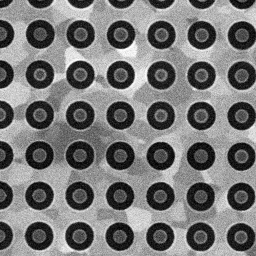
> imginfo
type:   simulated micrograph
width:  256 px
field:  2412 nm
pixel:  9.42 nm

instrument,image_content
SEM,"an array of small figures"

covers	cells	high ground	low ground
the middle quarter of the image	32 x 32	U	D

UDDDDDDUUUUDDDDDDUUUUDDDDDDUUUUU
DDDUUDDDUUUDDUUDDDUUUDDDDDDDUUUD
DDDUUUDDUUDDDUUUDDUUUDDUUUDDUUDD
DDDUUDDDUUDDDUUUDDUUUDDUUDDDUUUD
UDDDDDDUUUUDDDDDDDUUUDDDDDDDUUUD
UUDDDDDUUUUUDDDDDUUUUUDDDDDUUUUU
UUUDDUUUUUUUUDDUUUUUUUUDDUUUUUUU
UUUUUUUUUUUUUUUUUUUUUUUUUUUUUUUU
UUUUUUUUUUUUUUUUUUUUUUUUUUUUUUUU
UUDDDDUUUUUUUDDDUUUUUUUDDDUUUUUU
UDDDDDDUUUUDDDDDDUUUUDDDDDDUUUUU
DDDUUDDDUUUDDDUDDDUUUDDDDDDDUUUD
DDDUUDDDUUDDDUUUDDUUDDDUUUDDUUUD
DDDUUDDDUUDDDUUDDDUUDDDUUUDDUUUD
UDDDDDDUUUUDDDDDDDUUUDDDDDDDUUUD
UDDDDDDUUUUUDDDDDUUUUUDDDDDUUUUU
UUUDDUUUUUUUUDDUUUUUUUUDDUUUUUUU
UUUUUUUUUUUUUUUUUUUUUUUUUUUUUUUU
UUUUUUUUUUUUUUUUUUUUUUUUUUUUUUUU
UUDDDDUUUUUUUDDUUUUUUUUDDUUUUUUU
UDDDDDDUUUUDDDDDDUUUUUDDDDDUUUUU
UDDDDDDDUUUDDDDDDUUUUDDDUDDUUUUD
DDDUUDDDUUDDDUUUDDUUDDDUUUDDUUUD
DDDUUDDDUUDDDUUUDDUUUDDUUUDDUUUD
UDDDDDDUUUUDDDDDDUUUUDDDUDDDUUUD
UDDDDDDUUUUDDDDDDUUUUUDDDDDUUUUU
UUUDDUUUUUUUUDDUUUUUUUUDDUUUUUUU
UUUUUUUUUUUUUUUUUUUUUUUUUUUUUUUU
UUUUUUUUUUUUUUUUUUUUUUUUUUUUUUUU
UUUDDUUUUUUUUDDUUUUUUUUDDUUUUUUU
UDDDDDDUUUUDDDDDDUUUUDDDDDDUUUUU
UDDUUDDUUUUDDDDDDUUUUDDDDDDUUUUD